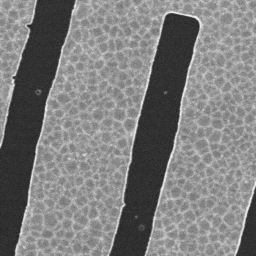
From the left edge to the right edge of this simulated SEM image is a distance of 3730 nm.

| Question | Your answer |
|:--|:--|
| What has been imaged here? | one or a few lines or trenches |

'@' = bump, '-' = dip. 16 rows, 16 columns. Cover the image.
@@---@@@@@@@@@@@
@@--@@@@@@--@@@@
@@--@@@@@@--@@@@
@---@@@@@@--@@@@
@---@@@@@---@@@@
@--@@@@@@---@@@@
@--@@@@@@--@@@@@
---@@@@@@--@@@@@
---@@@@@---@@@@@
--@@@@@@---@@@@@
--@@@@@@--@@@@@@
--@@@@@@--@@@@@@
--@@@@@@--@@@@@@
--@@@@@---@@@@@-
-@@@@@@--@@@@@@-
-@@@@@@--@@@@@@-